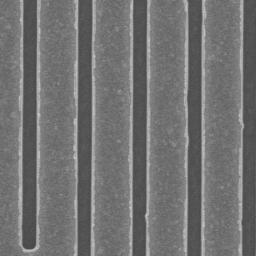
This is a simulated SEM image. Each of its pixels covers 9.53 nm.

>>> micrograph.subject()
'parallel lines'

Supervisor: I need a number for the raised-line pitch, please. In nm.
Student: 524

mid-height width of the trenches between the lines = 139 nanometres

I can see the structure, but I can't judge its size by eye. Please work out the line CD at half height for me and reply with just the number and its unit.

385 nm